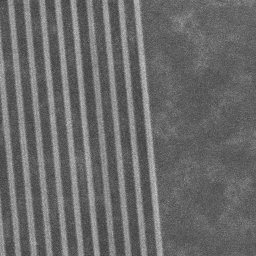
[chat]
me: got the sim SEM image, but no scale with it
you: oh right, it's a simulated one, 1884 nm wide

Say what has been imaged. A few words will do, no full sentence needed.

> parallel lines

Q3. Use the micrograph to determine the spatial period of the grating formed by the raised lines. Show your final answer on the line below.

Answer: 115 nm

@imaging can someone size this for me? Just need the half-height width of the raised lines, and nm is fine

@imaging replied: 29.3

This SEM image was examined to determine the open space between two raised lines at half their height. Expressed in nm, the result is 87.